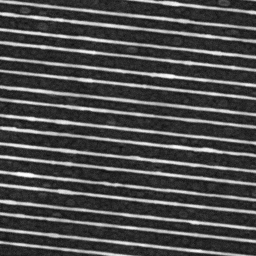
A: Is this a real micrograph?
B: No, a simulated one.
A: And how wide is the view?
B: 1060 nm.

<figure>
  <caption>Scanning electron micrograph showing parallel lines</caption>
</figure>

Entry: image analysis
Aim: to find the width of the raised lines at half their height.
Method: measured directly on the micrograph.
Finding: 10.8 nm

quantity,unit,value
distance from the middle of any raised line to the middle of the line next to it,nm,58.7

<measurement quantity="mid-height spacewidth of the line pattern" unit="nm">42.6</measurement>